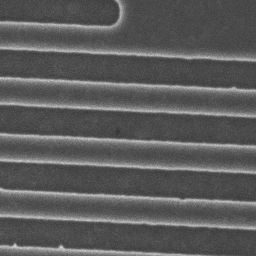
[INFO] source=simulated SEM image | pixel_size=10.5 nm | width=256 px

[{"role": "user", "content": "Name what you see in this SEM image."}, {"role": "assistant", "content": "parallel lines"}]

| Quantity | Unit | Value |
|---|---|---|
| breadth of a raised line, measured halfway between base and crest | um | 0.28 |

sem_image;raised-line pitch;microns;0.59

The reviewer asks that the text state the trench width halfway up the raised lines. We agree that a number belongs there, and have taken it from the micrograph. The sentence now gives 29.3 px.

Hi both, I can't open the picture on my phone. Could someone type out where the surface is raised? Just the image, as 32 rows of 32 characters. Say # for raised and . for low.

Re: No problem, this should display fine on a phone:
...............#################
...............#################
...............#################
################################
################################
################################
...........#####################
...............................#
................................
................................
################................
################################
################################
...........#####################
.............................#.#
................................
................................
################................
################################
################################
.........#######################
.............................###
................................
................................
###############.................
################################
################################
..........######################
.............................###
................................
................................
################................